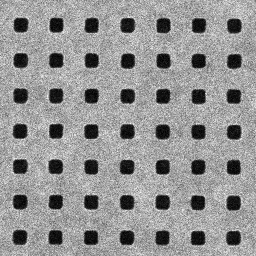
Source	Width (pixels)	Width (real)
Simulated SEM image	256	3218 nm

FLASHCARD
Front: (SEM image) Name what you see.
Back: a regular array of holes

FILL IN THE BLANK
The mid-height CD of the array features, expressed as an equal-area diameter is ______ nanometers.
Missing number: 202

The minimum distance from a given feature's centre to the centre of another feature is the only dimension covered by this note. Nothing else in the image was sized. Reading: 442 nanometers